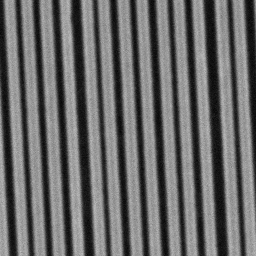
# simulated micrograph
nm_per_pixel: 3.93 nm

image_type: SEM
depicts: parallel lines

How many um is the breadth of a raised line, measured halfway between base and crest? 0.0377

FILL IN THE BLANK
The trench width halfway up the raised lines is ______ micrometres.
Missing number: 0.0377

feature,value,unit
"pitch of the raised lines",74.7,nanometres